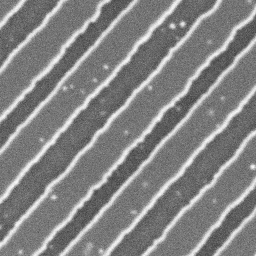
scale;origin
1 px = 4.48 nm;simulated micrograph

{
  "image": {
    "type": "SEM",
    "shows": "lines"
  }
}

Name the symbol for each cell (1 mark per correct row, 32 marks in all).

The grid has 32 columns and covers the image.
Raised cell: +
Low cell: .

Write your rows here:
+++....++++++...++++++.....+++++
++....++++++...++++++.....++++++
+.....++++++..++++++.....++++++.
.....++++++...+++++.....++++++..
....++++++...++++++....++++++...
...++++++...++++++....++++++...+
..++++++...++++++....+++++++..++
.++++++...++++++....++++++...+++
++++++...++++++.....+++++....+++
+++++...++++++.....++++++...++++
++++...++++++.....++++++...+++++
+++....+++++.....++++++...++++++
+++...+++++.....++++++...++++++.
++...+++++.....++++++...++++++..
+...+++++.....++++++...++++++...
...++++++....++++++...++++++....
..++++++....+++++++..++++++.....
.++++++.....++++++..++++++.....+
++++++.....++++++...+++++.....++
+++++.....++++++...+++++.....+++
++++.....++++++...++++++....++++
+++.....++++++...++++++....+++++
++.....++++++...++++++.....+++++
++....++++++...++++++.....++++++
+....++++++...++++++.....++++++.
....++++++...++++++.....++++++..
...++++++...++++++.....+++++....
..+++++++...+++++.....++++++...+
..++++++...++++++....++++++...++
.++++++...+++++.....++++++...+++
++++++...++++++....++++++...++++
+++++...++++++....+++++++..+++++